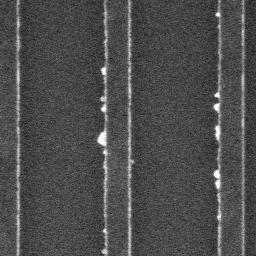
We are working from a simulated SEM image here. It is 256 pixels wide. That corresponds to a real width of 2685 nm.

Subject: lines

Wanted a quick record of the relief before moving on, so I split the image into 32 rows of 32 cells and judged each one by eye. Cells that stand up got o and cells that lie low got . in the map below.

oo...........ooo...........ooo..
oo...........ooo...........ooo..
oo...........ooo...........ooo..
oo...........ooo...........ooo..
oo...........ooo...........ooo..
oo...........ooo...........ooo..
oo...........ooo...........ooo..
oo...........ooo...........ooo..
oo...........ooo...........ooo..
oo...........ooo...........ooo..
oo...........ooo...........ooo..
oo...........ooo...........ooo..
oo...........ooo...........ooo..
oo...........ooo...........ooo..
oo...........ooo...........ooo..
oo...........ooo...........ooo..
oo...........ooo...........ooo..
oo...........ooo...........ooo..
oo...........ooo...........ooo..
oo...........ooo...........ooo..
oo...........ooo...........ooo..
oo...........ooo...........ooo..
oo...........ooo...........ooo..
oo...........ooo...........ooo..
oo...........ooo...........ooo..
oo...........ooo...........ooo..
oo...........ooo...........ooo..
oo...........ooo...........ooo..
oo...........ooo...........ooo..
oo...........ooo...........ooo..
oo...........ooo...........ooo..
oo...........ooo...........ooo..